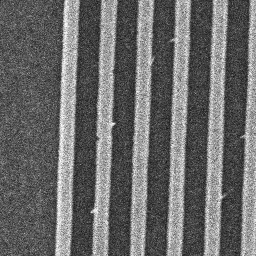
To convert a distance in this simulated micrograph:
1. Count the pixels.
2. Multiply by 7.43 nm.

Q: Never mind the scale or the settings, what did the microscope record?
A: parallel lines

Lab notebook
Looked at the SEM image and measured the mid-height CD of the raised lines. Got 93.7 nm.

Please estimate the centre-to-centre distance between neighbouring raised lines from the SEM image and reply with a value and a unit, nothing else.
0.276 microns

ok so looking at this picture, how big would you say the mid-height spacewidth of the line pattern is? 180 nm